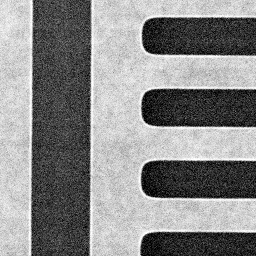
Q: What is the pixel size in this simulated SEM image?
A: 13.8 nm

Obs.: groups of lines, slits or small figures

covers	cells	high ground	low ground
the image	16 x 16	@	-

@@----@@@@@@@@@@
@@----@@@-------
@@----@@@-------
@@----@@@@@@----
@@----@@@@@@@@@@
@@----@@@@---@@@
@@----@@@-------
@@----@@@-------
@@----@@@@@@@@@@
@@----@@@@@@@@@@
@@----@@@-------
@@----@@@-------
@@----@@@@@@@@@@
@@----@@@@@@@@@@
@@----@@@@------
@@----@@@-------